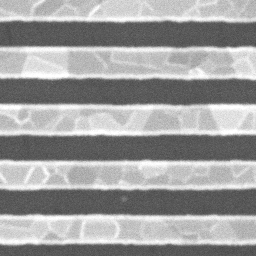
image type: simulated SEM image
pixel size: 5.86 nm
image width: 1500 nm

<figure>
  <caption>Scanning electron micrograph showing lines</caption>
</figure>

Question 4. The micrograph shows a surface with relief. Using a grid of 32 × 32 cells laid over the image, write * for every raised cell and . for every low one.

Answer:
********************************
********************************
..............**............****
................................
................................
................................
********************************
********************************
********************************
********************************
................................
................................
................................
********************************
********************************
********************************
********************************
................................
................................
................................
********************************
********************************
********************************
*****.....*.*******..******.....
................................
................................
................................
********************************
********************************
********************************
............................***.
................................